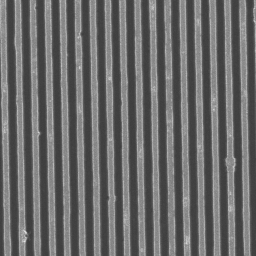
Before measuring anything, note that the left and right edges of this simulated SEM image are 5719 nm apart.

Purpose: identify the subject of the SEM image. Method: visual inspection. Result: parallel lines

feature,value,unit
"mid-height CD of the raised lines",162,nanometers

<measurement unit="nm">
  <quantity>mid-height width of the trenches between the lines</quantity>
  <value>182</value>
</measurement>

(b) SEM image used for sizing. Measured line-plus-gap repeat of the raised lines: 15 px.